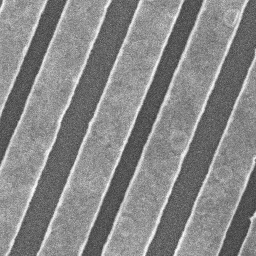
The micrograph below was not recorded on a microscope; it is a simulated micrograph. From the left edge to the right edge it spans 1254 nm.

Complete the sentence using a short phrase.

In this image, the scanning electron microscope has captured parallel lines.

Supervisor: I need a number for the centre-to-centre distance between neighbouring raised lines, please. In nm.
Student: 311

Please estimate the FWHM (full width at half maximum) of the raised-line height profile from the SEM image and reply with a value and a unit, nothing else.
196 nanometers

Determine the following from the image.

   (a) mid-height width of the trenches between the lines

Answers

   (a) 26.4 pixels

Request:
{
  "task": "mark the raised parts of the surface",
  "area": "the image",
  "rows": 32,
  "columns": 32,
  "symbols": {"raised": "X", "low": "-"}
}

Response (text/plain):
XXXXXX--XXXXXX---XXXXXX--XXXXXX-
XXXXX---XXXXX----XXXXX---XXXXX--
XXXXX--XXXXXX----XXXXX---XXXXX--
XXXX---XXXXX----XXXXXX--XXXXXX--
XXXX---XXXXX----XXXXX---XXXXX---
XXXX--XXXXXX---XXXXXX--XXXXXX---
XXX---XXXXX----XXXXX---XXXXX----
XXX--XXXXXX----XXXXX---XXXXX----
XX---XXXXX----XXXXXX--XXXXXX---X
XX---XXXXX----XXXXX---XXXXX----X
XX--XXXXXX---XXXXXX--XXXXXX----X
X---XXXXX----XXXXX---XXXXX----XX
X--XXXXXX----XXXXX---XXXXX----XX
---XXXXX----XXXXXX--XXXXXX---XXX
---XXXXX----XXXXX---XXXXX----XXX
--XXXXXX---XXXXXX--XXXXXX---XXXX
--XXXXX----XXXXX---XXXXX----XXXX
-XXXXXX----XXXXX--XXXXXX----XXXX
-XXXXX----XXXXX---XXXXX----XXXXX
-XXXXX----XXXXX---XXXXX----XXXXX
XXXXXX---XXXXXX--XXXXXX---XXXXXX
XXXXX----XXXXX---XXXXX----XXXXX-
XXXXX----XXXXX--XXXXXX----XXXXX-
XXXX----XXXXX---XXXXX----XXXXXX-
XXXX----XXXXX---XXXXX----XXXXX--
XXXX---XXXXXX--XXXXXX---XXXXXX--
XXX----XXXXX---XXXXX----XXXXX---
XXX---XXXXXX--XXXXXX----XXXXX--X
XX----XXXXX---XXXXX----XXXXXX--X
XX----XXXXX---XXXXX----XXXXX---X
XX---XXXXXX--XXXXXX---XXXXXX--XX
X----XXXXX---XXXXX----XXXXX---XX